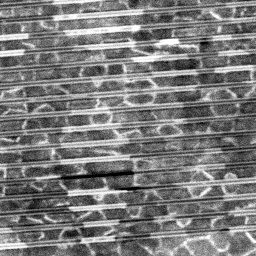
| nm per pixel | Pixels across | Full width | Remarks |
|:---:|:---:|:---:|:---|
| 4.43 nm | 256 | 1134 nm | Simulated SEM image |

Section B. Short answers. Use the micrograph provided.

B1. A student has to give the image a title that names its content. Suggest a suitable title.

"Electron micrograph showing parallel lines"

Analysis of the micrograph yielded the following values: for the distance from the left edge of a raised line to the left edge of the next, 70.9 nm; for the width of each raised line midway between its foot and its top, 18.8 nanometers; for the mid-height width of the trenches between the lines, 0.053 micrometres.